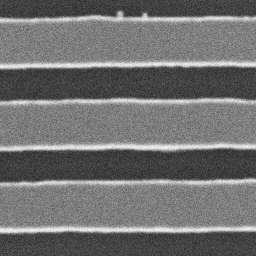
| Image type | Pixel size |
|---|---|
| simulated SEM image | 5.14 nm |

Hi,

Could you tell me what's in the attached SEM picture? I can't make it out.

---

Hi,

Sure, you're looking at lines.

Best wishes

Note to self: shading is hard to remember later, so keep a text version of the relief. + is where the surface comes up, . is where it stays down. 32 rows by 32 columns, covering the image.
................................
................................
+++.++++++++++++++++++++++++++++
++++++++++++++++++++++++++++++++
++++++++++++++++++++++++++++++++
++++++++++++++++++++++++++++++++
++++++++++++++++++++++++++++++++
++++++++++++++++++++++++++++++++
................................
................................
................................
................................
.............++++.......++++++..
++++++++++++++++++++++++++++++++
++++++++++++++++++++++++++++++++
++++++++++++++++++++++++++++++++
++++++++++++++++++++++++++++++++
++++++++++++++++++++++++++++++++
+++++++++++++++++++++++++++..+++
................................
................................
................................
..............................++
++++++++++++++++++++++++++++++++
++++++++++++++++++++++++++++++++
++++++++++++++++++++++++++++++++
++++++++++++++++++++++++++++++++
++++++++++++++++++++++++++++++++
++++++++++++++++++++++++++++++++
................................
................................
................................